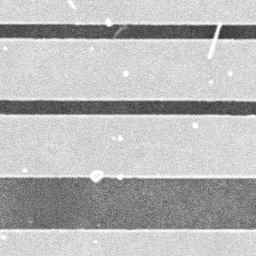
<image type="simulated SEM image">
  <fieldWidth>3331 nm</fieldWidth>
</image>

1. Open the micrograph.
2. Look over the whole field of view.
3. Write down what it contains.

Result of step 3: lines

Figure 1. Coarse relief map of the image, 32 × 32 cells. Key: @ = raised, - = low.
@@@@@@@@@@@@@@@@@@@@@@@@@@@@@@@@
@@@@@@@@@@@@@@@@@@@@@@@@@@@@@@@@
@@@@@@@@@@@@@@@@@@@@@@@@@@@@@@@@
--------------------------------
--------------------------------
@@@@@@@@@@@@@@@@@@@@@@@@@@@@@@@@
@@@@@@@@@@@@@@@@@@@@@@@@@@@@@@@@
@@@@@@@@@@@@@@@@@@@@@@@@@@@@@@@@
@@@@@@@@@@@@@@@@@@@@@@@@@@@@@@@@
@@@@@@@@@@@@@@@@@@@@@@@@@@@@@@@@
@@@@@@@@@@@@@@@@@@@@@@@@@@@@@@@@
@@@@@@@@@@@@@@@@@@@@@@@@@@@@@@@@
-------------------------@@@-@@@
--------------------------------
@@@@@@@@@@@@@@@@@@@@@@@@@@@@@--@
@@@@@@@@@@@@@@@@@@@@@@@@@@@@@@@@
@@@@@@@@@@@@@@@@@@@@@@@@@@@@@@@@
@@@@@@@@@@@@@@@@@@@@@@@@@@@@@@@@
@@@@@@@@@@@@@@@@@@@@@@@@@@@@@@@@
@@@@@@@@@@@@@@@@@@@@@@@@@@@@@@@@
@@@@@@@@@@@@@@@@@@@@@@@@@@@@@@@@
@@@@@@@@@@@@@@@@@@@@@@@@@@@@@@@@
--------------------------------
--------------------------------
--------------------------------
--------------------------------
--------------------------------
--------------------------------
--------------------------------
@@@@@@@@@@@@@@@@@@@@@@@@@@@@@@@@
@@@@@@@@@@@@@@@@@@@@@@@@@@@@@@@@
@@@@@@@@@@@@@@@@@@@@@@@@@@@@@@@@